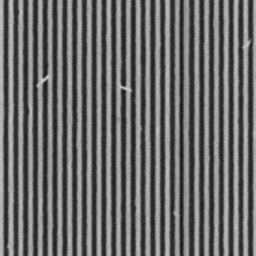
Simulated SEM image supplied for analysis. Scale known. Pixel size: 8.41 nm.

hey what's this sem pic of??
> parallel lines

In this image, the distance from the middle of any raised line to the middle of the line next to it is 82.2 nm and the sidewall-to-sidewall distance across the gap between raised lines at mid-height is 45.2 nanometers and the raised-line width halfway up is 4.49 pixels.